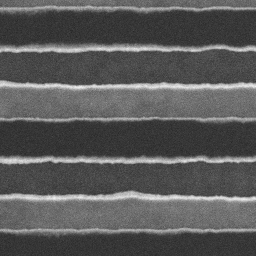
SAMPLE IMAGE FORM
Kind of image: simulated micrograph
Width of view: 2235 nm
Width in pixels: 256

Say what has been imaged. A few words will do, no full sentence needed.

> lines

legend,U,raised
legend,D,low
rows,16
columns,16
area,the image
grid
UUUUUUUUUUUUUUUU
UUUUUUUUUUUUUUUU
UUUUUUUUUUUUUUUU
DDDDDDDDDDDDDDDD
DDDDDDDDDDDDDDDD
UUUUUUUUUUUUUUUU
UUUUUUUUUUUUUUUU
UUUUUUUUUUUUUUUU
UUUUUUUUUUUUUUUU
UUUUUUUUUUUUUUUU
DDDDDDDDDDDDDDDD
DDDDDDDDDDDDDDDD
UUUUUUUUUUUUUUUU
UUUUUUUUUUUUUUUU
UUUUUUUUUUUUUUUU
UUUUUUUUUUUUUUUU